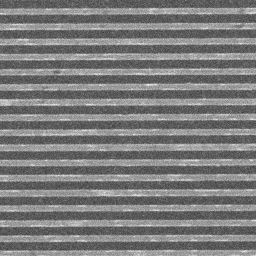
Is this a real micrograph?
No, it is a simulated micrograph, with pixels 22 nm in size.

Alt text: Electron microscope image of parallel lines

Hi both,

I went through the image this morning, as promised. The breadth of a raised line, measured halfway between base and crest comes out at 5.62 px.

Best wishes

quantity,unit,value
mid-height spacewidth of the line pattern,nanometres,206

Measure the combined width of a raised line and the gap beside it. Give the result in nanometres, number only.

332